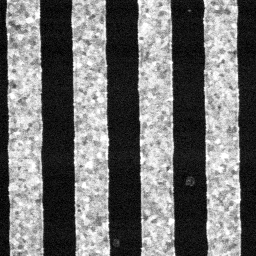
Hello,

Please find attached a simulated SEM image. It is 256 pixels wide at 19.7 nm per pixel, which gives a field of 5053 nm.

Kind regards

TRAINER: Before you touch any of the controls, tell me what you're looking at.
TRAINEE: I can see wiring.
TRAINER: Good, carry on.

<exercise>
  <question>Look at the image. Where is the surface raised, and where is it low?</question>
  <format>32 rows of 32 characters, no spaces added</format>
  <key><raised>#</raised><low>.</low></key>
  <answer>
.####....####....####.....####..
.####....####....####.....####..
.####....####....####.....####..
.####....####....####.....####..
.####....####....####.....####..
.####....####....####.....####..
.####....####....####.....####..
.####....####....####.....####..
.####....####....####.....####..
.####....####....####.....####..
.####....####....####.....####..
.####....####....####.....####..
.####....####.....###.....####..
.####....####.....###.....####..
.####....####.....###.....####..
.####....####.....###.....####..
.####....####.....###.....####..
.####....####.....####....####..
.####....####.....####....####..
.####....####.....####....####..
.####....####.....###.....####..
.####....####.....####....####..
.####....####.....####....####..
.####....####.....####....####..
.####....####.....####....####..
.####.....###.....####....####..
.####.....###.....####....####..
.####.....###.....####....####..
.####.....###.....####....####..
.####.....###.....####....####..
.####.....####....####....####..
.####.....####....####....####..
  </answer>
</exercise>